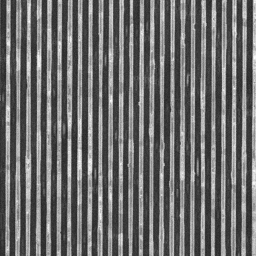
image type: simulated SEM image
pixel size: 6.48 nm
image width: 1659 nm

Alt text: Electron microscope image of parallel lines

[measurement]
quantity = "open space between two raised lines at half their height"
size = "46.2 nanometres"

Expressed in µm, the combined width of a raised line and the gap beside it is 0.0666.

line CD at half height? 17 nm